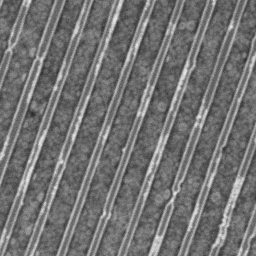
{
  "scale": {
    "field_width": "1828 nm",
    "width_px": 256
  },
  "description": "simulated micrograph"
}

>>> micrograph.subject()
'parallel lines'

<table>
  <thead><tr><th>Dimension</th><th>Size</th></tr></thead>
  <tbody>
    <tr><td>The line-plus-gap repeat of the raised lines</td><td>28.8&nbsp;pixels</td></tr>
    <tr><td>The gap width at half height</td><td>155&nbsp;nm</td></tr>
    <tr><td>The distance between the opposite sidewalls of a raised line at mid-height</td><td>51.3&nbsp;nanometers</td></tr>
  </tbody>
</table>